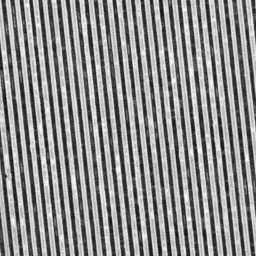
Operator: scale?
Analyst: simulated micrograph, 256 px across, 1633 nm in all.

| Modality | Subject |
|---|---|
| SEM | parallel lines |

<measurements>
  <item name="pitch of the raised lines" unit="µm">0.0587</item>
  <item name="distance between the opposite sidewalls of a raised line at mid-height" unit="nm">27.7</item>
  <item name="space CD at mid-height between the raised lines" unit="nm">28.5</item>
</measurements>